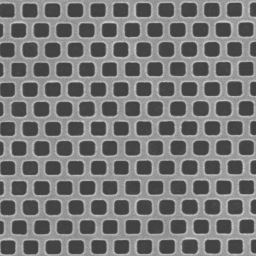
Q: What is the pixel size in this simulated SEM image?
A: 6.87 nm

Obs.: a regular array of holes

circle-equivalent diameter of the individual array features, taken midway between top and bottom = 114 nm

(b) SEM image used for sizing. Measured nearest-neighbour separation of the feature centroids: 155 nm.